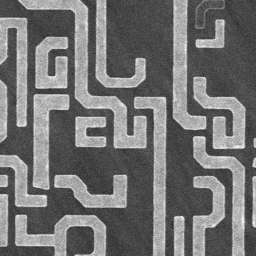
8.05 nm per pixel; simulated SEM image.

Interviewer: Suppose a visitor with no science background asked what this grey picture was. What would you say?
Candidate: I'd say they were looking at wiring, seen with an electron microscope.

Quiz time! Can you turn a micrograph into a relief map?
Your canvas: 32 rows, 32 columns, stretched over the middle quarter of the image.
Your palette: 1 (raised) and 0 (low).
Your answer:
10011100110000000011000000001110
10011100110000000011000000001110
10011100111000000011000000001110
10011100111100000111000000001110
10011100011111111110000000001110
10011100001111111100000000001110
00011100000000000000000000001110
00011100000000000000000000001110
10011111111110000011111110001110
10001111111111000011111110011110
10000111111111100011111110011110
00000000000011010000001110011110
00000000000001110000000110011110
00011111110001110011000110011111
00011111110001110011000110001111
00011111110001110011000110000111
00011000000001110011000110000000
00011000000001110011000110000000
00011111110001111111000110000000
00011111110001111111000110000000
00011111110001111111000110000000
00000000000000000000000110000000
00000000000000000000000110000000
00000000000000000000000110000000
00000000000000000000000110000000
00000000000000000000000110000000
00000000000000000000000110000000
00000000000000000000000110000000
11110000000001110000000110000000
11110000000001110000000110000000
11111000000001110000000110000000
00111100000001110000000110000000